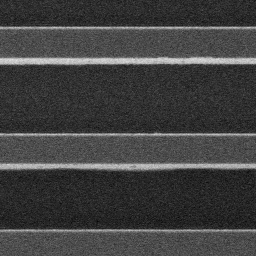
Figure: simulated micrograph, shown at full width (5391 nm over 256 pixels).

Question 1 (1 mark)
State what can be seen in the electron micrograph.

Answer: lines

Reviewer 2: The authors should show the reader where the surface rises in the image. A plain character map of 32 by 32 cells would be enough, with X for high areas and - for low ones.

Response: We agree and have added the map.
--------------------------------
--------------------------------
--------------------------------
-------X-------------------XX--X
XXXXXXXXXXXXXXXXXXXXXXXXXXXXXXXX
XXXXXXXXXXXXXXXXXXXXXXXXXXXXXXXX
XXXXXXXXXXXXXXXXXXXXXXXXXXXXXXXX
XXXXXXXXXXXXXXXXXXXXXXXXXXXXXXXX
--------------------------------
--------------------------------
--------------------------------
--------------------------------
--------------------------------
--------------------------------
--------------------------------
--------------------------------
--------------------------------
XXXXXXXXXXXXXXXXXXXXXXXXXXXXXXXX
XXXXXXXXXXXXXXXXXXXXXXXXXXXXXXXX
XXXXXXXXXXXXXXXXXXXXXXXXXXXXXXXX
XXXXXXXXXXXXXXXXXXXXXXXXXXXXXXXX
--------------------------------
--------------------------------
--------------------------------
--------------------------------
--------------------------------
--------------------------------
--------------------------------
--------------------------------
XXXXXXXXXXXXXXXXXXXXXXXXXXXXXXXX
XXXXXXXXXXXXXXXXXXXXXXXXXXXXXXXX
XXXXXXXXXXXXXXXXXXXXXXXXXXXXXXXX